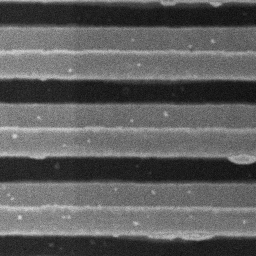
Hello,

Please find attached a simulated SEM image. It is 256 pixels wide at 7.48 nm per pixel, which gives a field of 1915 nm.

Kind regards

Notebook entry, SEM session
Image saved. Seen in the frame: lines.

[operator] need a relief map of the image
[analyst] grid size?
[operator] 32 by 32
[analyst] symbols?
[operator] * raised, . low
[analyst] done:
....................**....**....
................................
................................
****.*..**....*.................
********************************
********************************
********************************
********************************
********************************
********************************
................................
................................
................................
********************************
********************************
********************************
********************************
********************************
********************************
...***.*....*.*..***************
................................
................................
................................
********************************
********************************
********************************
********************************
********************************
********************************
..............*...*********..***
................................
................................